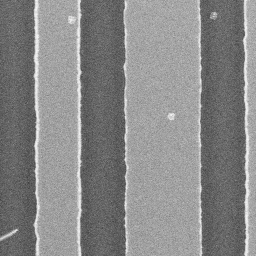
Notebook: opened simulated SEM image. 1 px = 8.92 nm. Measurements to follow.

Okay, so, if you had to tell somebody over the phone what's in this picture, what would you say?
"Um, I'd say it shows lines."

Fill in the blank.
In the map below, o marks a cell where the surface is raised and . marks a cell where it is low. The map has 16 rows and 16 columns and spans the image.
..ooo...oooo...o
..ooo...oooo...o
..ooo...oooo...o
..ooo...ooooo..o
..ooo...ooooo..o
..ooo...ooooo..o
..ooo...ooooo..o
..ooo...oooo...o
..ooo...oooo...o
..ooo...ooooo..o
..ooo...ooooo..o
..ooo...ooooo..o
..ooo...oooo...o
..ooo...ooooo..o
..ooo...ooooo..o
..ooo...ooooo..o